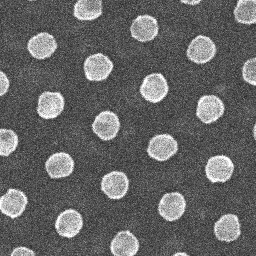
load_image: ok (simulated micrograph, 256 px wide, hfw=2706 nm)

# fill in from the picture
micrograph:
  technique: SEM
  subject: a regular array of raised bodies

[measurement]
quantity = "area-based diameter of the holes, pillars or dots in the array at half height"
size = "275 nm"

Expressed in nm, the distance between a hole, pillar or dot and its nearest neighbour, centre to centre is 629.